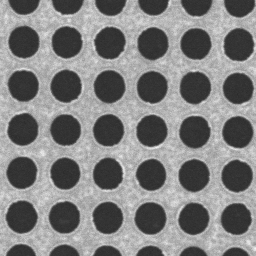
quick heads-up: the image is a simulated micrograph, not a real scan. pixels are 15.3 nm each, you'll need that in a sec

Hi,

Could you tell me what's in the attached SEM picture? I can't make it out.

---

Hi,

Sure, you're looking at a regular array of holes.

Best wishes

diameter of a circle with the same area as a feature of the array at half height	494	nm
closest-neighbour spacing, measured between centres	0.655	micrometres